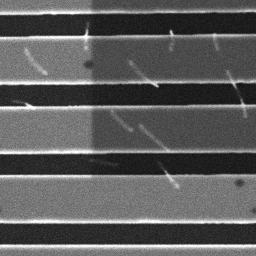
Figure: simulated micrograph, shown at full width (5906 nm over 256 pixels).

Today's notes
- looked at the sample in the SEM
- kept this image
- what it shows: lines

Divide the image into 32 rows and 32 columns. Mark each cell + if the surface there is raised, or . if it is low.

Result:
++++++++++++++++++++++++++++++++
+++++++++++++++++++++++++++.....
................................
................................
..........+...++++++++++++++++++
++++++++++++++++++++++++++++++++
++++++++++++++++++++++++++++++++
++++++++++++++++++++++++++++++++
++++++++++++++++++++++++++++++++
++++++++++++++++++++++++++++++++
...................+............
................................
................................
++++++++++++++++++++++++++++++++
++++++++++++++++++++++++++++++++
++++++++++++++++++++++++++++++++
++++++++++++++++++++++++++++++++
++++++++++++++++++++++++++++++++
++++++++++++++++++++++++++++++++
................................
................................
................................
++++++++++++++++++++++++++++++++
++++++++++++++++++++++++++++++++
++++++++++++++++++++++++++++++++
++++++++++++++++++++++++++++++++
++++++++++++++++++++++++++++++++
++++++++++++++++++++++++++++++++
................................
................................
................................
++++++++++++++++++++++++++++++++